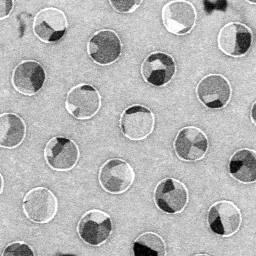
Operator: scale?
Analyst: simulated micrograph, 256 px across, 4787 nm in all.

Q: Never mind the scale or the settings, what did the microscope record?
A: a regular array of raised bodies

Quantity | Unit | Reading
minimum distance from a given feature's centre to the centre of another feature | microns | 1.05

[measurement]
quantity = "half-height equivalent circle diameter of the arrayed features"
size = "34.4 px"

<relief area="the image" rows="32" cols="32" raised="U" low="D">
UUDDDDDDDDDDDDUUUDDDDUUUDDDDDDDD
UDDDDUUUDDDDDDDUDDDDUUUUDDDDDDDD
DDDDUUUUDDDDDDDDDDDDUUUUDDDDDDDD
DDDDUUUUDDDDDDDDDDDDDUUUDDDDUUUD
DDDDDUUUDDDDUUUDDDDDDDDDDDDUUUUD
DDDDDDDDDDDUUUUDDDDDDDDDDDDUUUUD
DDDDDDDDDDDUUUUDDDDDDDDDDDDDUUUD
DDDDDDDDDDDDUUDDDDUUUUDDDDDDDDDD
DDUUUDDDDDDDDDDDDDUUUUDDDDDDDDDD
DDUUUUDDDDDDDDDDDDUUUUDDDDUUDDDD
DDUUUDDDDDDDDDDDDDDUUDDDDUUUUDDD
DDDUUDDDDUUUDDDDDDDDDDDDDUUUUDDD
DDDDDDDDUUUUUDDDDDDDDDDDDUUUUDDD
DDDDDDDDUUUUDDDDUUDDDDDDDDUUDDDU
UUDDDDDDDUUUDDDUUUUDDDDDDDDDDDDU
UUUDDDDDDDDDDDDUUUUDDDDDDDDDDDDD
UUUDDDDDDDDDDDDUUUUDDDUUUDDDDDDD
UUUDDDUUUDDDDDDDDDDDDDUUUUDDDDDD
DDDDDDUUUUDDDDDDDDDDDDUUUUDDDDDD
DDDDDDUUUUDDDDDDDDDDDDUUUDDDDUUU
DDDDDDUUUDDDDUUUDDDDDDDDDDDDDUUU
DDDDDDDDDDDDDUUUDDDDDDDDDDDDDUUU
DDDDDDDDDDDDUUUUUDDDUUDDDDDDDDUU
DDDDDDDDDDDDDUUUDDDDUUUDDDDDDDDD
DDDUUUUDDDDDDDDDDDDUUUUDDDDDDDDD
DDDUUUUDDDDDDDDDDDDDUUUDDDDUUDDD
DDDUUUUDDDDUUDDDDDDDDUDDDDUUUUDD
DDDDUUDDDDUUUUDDDDDDDDDDDDUUUUDD
DDDDDDDDDDUUUUDDDDDDDDDDDDUUUUDD
DDDDDDDDDDUUUUDDDDUUDDDDDDDDDDDD
DUUDDDDDDDDUDDDDDUUUUDDDDDDDDDDD
UUUUDDDDDDDDDDDDDUUUUDDDDDDDDDDD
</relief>